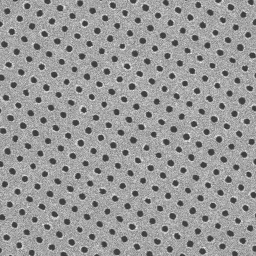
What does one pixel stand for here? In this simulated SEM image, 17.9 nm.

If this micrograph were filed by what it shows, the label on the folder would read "a regular array of holes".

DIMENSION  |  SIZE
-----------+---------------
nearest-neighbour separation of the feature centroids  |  257 nm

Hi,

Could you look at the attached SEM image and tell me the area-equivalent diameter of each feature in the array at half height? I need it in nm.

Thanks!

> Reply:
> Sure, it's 116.